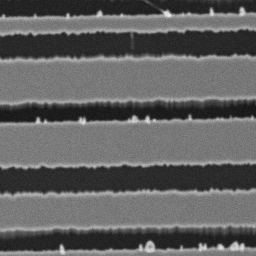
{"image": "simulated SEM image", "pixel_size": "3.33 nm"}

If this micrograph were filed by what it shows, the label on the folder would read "lines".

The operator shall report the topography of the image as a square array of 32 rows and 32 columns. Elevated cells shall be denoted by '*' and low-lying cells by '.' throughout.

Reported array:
................................
....................*.....*...*.
********************************
********************************
................................
................................
................................
********************************
********************************
********************************
********************************
********************************
********************************
................................
................................
********************************
********************************
********************************
********************************
********************************
**************************.*.*..
................................
................................
................................
********************************
********************************
********************************
********************************
******************************.*
................................
..................*..........*..
..**.***************************